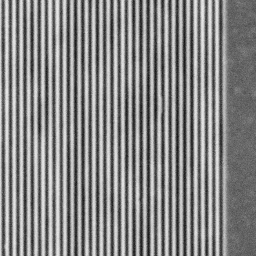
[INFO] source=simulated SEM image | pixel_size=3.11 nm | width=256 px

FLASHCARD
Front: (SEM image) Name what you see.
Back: parallel lines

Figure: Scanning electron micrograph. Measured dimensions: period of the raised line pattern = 22.5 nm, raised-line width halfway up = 11.3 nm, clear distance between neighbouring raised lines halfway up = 0.0113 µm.